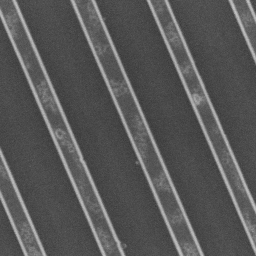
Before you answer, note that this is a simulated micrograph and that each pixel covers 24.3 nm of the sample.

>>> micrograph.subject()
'one or a few lines or trenches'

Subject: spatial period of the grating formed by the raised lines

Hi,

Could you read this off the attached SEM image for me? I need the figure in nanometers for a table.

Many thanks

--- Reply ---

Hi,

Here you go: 1710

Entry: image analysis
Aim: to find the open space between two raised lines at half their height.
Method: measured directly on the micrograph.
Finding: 1290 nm